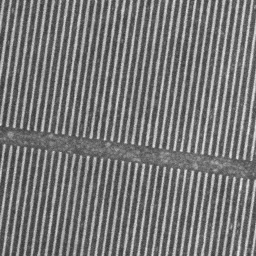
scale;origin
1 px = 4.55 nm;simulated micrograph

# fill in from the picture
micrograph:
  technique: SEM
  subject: parallel lines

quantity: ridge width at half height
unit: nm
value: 10.7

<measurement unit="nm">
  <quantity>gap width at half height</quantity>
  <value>21.4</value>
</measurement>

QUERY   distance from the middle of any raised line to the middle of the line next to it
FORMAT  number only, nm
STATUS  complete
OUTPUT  32.1